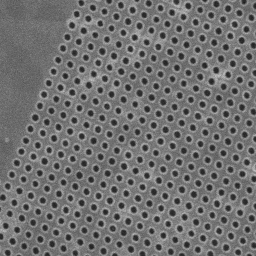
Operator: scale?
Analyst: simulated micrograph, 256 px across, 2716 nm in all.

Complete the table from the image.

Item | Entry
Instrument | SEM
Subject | a regular array of holes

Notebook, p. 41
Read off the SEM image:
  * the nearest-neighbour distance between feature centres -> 128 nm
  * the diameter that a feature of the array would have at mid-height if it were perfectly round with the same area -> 73.8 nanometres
